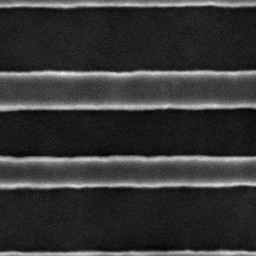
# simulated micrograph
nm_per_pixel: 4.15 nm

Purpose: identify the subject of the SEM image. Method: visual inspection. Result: lines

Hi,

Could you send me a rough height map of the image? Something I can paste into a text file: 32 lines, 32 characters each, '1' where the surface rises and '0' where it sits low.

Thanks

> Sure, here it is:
11111111111111111111111000011100
00000000000000000000000000000000
00000000000000000000000000000000
00000000000000000000000000000000
00000000000000000000000000000000
00000000000000000000000000000000
00000000000000000000000000000000
00000000000000000000000000000000
00000000000000000000000000000000
11111111111111111111111111111111
11111111111111111111111111111111
11111111111111111111111111111111
11111111111111111111111111111111
10000000000000000000000000000000
00000000000000000000000000000000
00000000000000000000000000000000
00000000000000000000000000000000
00000000000000000000000000000000
00000000000000000000000000000000
00000000000000000000000000000000
11111111111111111111111111111111
11111111111111111111111111111111
11111111111111111111111111111111
00000000000000000000000000000000
00000000000000000000000000000000
00000000000000000000000000000000
00000000000000000000000000000000
00000000000000000000000000000000
00000000000000000000000000000000
00000000000000000000000000000000
00000000000000000000000000000000
00000000000000000000000000000000